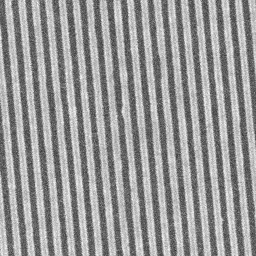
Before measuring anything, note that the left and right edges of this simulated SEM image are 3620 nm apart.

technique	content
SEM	parallel lines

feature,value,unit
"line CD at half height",79.2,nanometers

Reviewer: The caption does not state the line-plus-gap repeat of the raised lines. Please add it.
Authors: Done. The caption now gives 0.191 micrometres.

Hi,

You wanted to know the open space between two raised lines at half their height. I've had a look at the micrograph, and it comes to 0.114 um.